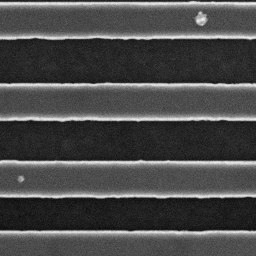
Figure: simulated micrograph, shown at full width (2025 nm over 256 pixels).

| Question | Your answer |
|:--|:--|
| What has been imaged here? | lines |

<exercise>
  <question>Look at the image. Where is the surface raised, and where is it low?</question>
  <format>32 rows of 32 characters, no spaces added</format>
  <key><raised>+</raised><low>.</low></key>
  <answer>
++++++++++++++++++++++++++++++++
++++++++++++++++++++++++++++++++
++++++++++++++++++++++++++++++++
++++++++++++++++++++++++++++++++
++++++++++++++++++++++++++++++++
................................
................................
................................
................................
................................
.+++++..+.++++++++++..+++++.....
++++++++++++++++++++++++++++++++
++++++++++++++++++++++++++++++++
++++++++++++++++++++++++++++++++
++++++++++++++++++++++++++++++++
................................
................................
................................
................................
................................
++++++++++++++++++++++++++++++++
++++++++++++++++++++++++++++++++
++++++++++++++++++++++++++++++++
++++++++++++++++++++++++++++++++
++++++++++++++++++++++++++++++++
................................
................................
................................
................................
++++++++++++++++++++++++++++++++
++++++++++++++++++++++++++++++++
++++++++++++++++++++++++++++++++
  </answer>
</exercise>